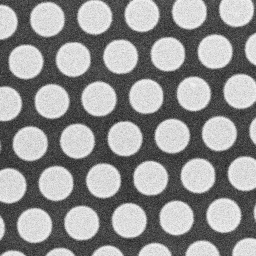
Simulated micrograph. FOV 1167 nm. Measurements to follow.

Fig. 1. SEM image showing an array of small figures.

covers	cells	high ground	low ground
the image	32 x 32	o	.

.....oo....oo...ooo...oooo..oooo
oo..oooo..oooo..oooo..oooo..oooo
oo..oooo..oooo..oooo..oooo..ooo.
oo..oooo..ooo....oo....o........
o.........................oo....
........oo....oo...oooo..oooo..o
..ooo..oooo..oooo..oooo..oooo..o
.oooo..oooo..oooo..oooo..oooo..o
.oooo..oooo...ooo...oo....o.....
..oo.....o...................oo.
...........oo....ooo...ooo..oooo
oo...ooo..oooo..oooo..oooo..oooo
ooo.ooooo.oooo..oooo..oooo..oooo
ooo..ooo...ooo...ooo...oo.......
oo...ooo........................
...............oo...ooo...ooo..o
..ooo...ooo...oooo.ooooo.oooo..o
..oooo..oooo..oooo.ooooo..ooo...
..oooo..oooo..ooo...ooo...ooo...
..ooo....oo.....................
..................oo...ooo...ooo
oo...oooo..oooo..oooo..oooo..ooo
ooo..oooo..oooo..oooo..oooo..ooo
ooo..oooo..oooo..oooo..ooo....oo
ooo...oo....oo..................
................o....oo...ooo...
...ooo...ooo..oooo..oooo..oooo..
..oooo..oooo..oooo..oooo..oooo..
..oooo..oooo..oooo..oooo...oo...
...ooo...ooo...oo...............
...................o....oo....oo
.o....ooo...ooo...ooo..oooo..ooo